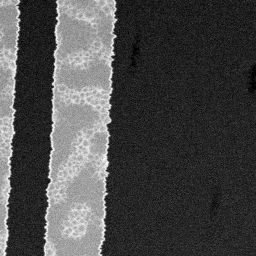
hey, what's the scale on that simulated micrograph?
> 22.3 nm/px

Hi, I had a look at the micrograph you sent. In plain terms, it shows one or a few lines or trenches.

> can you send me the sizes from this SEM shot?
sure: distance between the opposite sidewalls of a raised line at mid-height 1260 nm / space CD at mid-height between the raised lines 0.879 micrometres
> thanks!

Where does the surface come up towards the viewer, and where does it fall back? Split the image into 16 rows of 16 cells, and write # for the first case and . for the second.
#...###.........
#...###.........
#...###.........
#..####.........
#..####.........
#..####.........
#..####.........
#..####.........
#..####.........
#..####.........
#..####.........
#..####.........
...####.........
...###..........
...###..........
...###..........